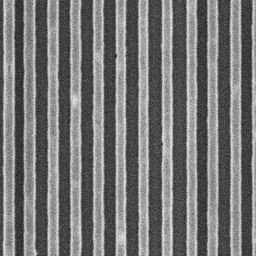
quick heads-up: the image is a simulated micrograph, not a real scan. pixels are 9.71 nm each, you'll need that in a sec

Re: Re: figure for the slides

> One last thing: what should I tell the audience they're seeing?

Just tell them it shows parallel lines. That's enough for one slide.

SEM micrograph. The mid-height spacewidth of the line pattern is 0.136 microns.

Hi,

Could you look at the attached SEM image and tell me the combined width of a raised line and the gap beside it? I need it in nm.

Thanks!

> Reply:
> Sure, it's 220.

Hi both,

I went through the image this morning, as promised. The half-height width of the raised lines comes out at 8.75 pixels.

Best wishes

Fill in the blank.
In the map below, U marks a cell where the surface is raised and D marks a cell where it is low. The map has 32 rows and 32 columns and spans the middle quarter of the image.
DDUUDDDDUUDDDUUDDDDUUDDDDUUDDDDU
DDUUDDDDUUDDDUUDDDDUUDDDDUUDDDDU
DDUUDDDDUUDDDUUDDDDUUDDDDUUDDDDU
DDUUDDDDUUDDDUUDDDDUUDDDDUUDDDDU
DDUUDDDDUUDDDUUDDDDUUDDDDUUDDDDU
DDUUDDDDUUDDDUUDDDDUUDDDDUUDDDDU
DDUUDDDDUUDDDUUDDDDUUDDDDUUDDDDU
DDUUDDDDUUDDDUUDDDDUUDDDDUUDDDDU
DDUUDDDUUUDDDUUDDDDUUDDDDUUDDDDU
DDUUDDDUUUDDDUUDDDDUUDDDDUUDDDDU
DDUUDDDDUUDDDUUDDDDUUDDDDUUDDDDU
DDUUDDDUUUDDDUUDDDDUUDDDDUUDDDDU
DDUUDDDUUUDDDUUDDDDUUDDDDUUDDDDU
DDUUDDDUUUDDDUUDDDDUUDDDDUUDDDDU
DDUUDDDUUUDDDUUDDDDUUDDDDUUDDDDU
DDUUDDDUUUDDDUUDDDDUUDDDDUUDDDDU
DDUUDDDDUUDDDUUDDDDUUDDDDUUDDDDU
DDUUDDDDUUDDDUUDDDDUUDDDDUUDDDDU
DDUUDDDDUUDDDUUDDDDUUDDDDUUDDDDU
DDUUDDDDUUDDDUUDDDDUUDDDDUUDDDDU
DDUUDDDUUUDDDUUDDDDUUDDDDUUDDDDU
DDUUDDDUUUDDDUUDDDDUUDDDDUUDDDDU
DDUUDDDUUUDDDUUDDDDUUDDDDUUDDDDU
DDUUDDDDUUDDDUUDDDDUUDDDDUUDDDDU
DDUUDDDDUUDDDUUDDDDUUDDDDUUDDDDU
DDUUDDDDUUDDDUUDDDDUUDDDDUUDDDDU
DDUUDDDUUUDDDUUDDDDUUDDDDUUDDDDU
DDUUDDDDUUDDDUUDDDDUUDDDDUUDDDDU
DDUUDDDDUUDDDUUDDDDUUDDDDUUDDDDU
DDUUDDDDUUDDDUUDDDDUUDDDDUUDDDDU
DDUUDDDDUUDDDUUDDDDUUDDDDUUDDDDU
DDUUDDDUUUDDDUUDDDDUUDDDDUUDDDDU